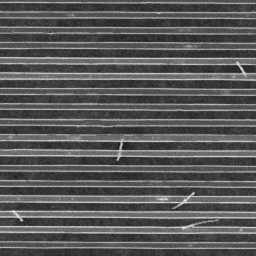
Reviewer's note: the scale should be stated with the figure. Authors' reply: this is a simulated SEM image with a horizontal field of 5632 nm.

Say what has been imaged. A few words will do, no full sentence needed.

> parallel lines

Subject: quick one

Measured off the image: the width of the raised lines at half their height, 0.143 µm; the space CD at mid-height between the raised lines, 0.203 µm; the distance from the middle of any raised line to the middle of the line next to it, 337 nanometres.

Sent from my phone